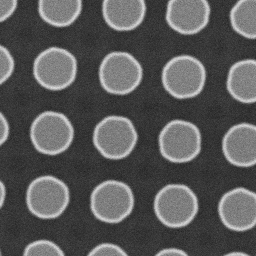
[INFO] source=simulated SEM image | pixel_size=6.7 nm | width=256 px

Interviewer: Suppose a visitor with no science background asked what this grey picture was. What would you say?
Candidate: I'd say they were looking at an array of small figures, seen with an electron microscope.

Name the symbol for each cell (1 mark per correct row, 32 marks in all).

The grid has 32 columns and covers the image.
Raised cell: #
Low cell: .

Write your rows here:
##...#####...#####...#####....##
##...#####...#####...#####...###
......###....#####...#####...###
..............###.....###....###
...............................#
................................
#.....##........................
##...####....####....####.......
##..#####....#####...####....###
#...#####....#####..######...###
.....####....####...#####...####
..............##.....####....###
..............................##
................................
.....###........................
#...#####...####.....###........
#...#####...#####...#####....###
#...#####...#####...#####...####
.....###....#####...#####...####
.............###.....###....####
.............................###
................................
.....##.........................
....####....####....###.........
#..######..######...####....####
...#####...######..######..#####
....####....####...######..#####
.............##.....####....####
.............................##.
................................
....###.........................
...#####...####.....###.........